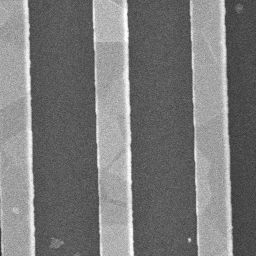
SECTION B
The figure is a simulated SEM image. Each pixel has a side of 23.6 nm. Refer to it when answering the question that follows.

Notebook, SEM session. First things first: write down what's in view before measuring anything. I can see lines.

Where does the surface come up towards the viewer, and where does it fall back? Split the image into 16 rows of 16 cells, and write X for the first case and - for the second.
XX----XX----XX--
XX----XX----XX--
XX----XX----XX--
XX----XX----XX--
XX----XX----XX--
XX----XX----XX--
XX----XX----XX--
XX----XX----XX--
XX----XX----XX--
XX----XX----XX--
XX----XX----XX--
XX----XX----XX--
XX----XX----XX--
XX----XX----XX--
XX----XX----XX--
XX----XX----XXX-